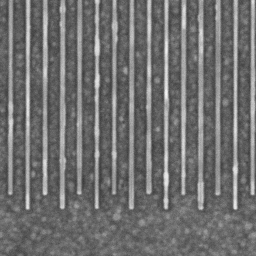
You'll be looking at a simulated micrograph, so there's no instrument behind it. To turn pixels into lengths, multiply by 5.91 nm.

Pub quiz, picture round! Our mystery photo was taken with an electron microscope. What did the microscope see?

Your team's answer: parallel lines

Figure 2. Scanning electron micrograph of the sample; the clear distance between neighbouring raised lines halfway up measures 83.5 nm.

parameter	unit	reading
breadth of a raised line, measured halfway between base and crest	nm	22.2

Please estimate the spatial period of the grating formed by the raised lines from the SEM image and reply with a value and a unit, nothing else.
102 nanometres